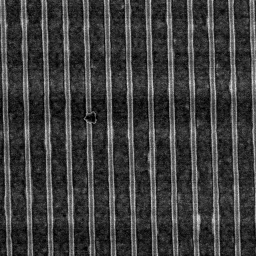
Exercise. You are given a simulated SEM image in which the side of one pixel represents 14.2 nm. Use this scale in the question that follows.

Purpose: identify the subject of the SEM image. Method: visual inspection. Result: parallel lines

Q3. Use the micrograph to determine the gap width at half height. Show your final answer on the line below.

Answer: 229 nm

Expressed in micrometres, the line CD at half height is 0.0658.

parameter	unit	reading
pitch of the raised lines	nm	296